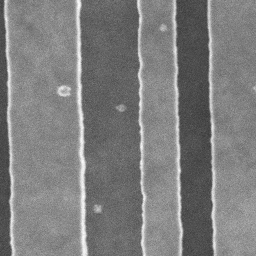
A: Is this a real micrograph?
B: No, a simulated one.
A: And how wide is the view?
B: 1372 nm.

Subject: lines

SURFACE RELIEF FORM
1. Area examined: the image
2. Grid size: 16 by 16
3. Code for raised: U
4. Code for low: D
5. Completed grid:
UUUUUDDDDUUDDUUU
UUUUUDDDDUUDDUUU
UUUUUDDDDUUDDUUU
UUUUUDDDDUUDDUUU
DUUUUDDDDUUDDUUU
DUUUUDDDDUUDDUUU
DUUUUDDDDUUDDUUU
DUUUUDDDDUUDDUUU
DUUUUDDDDUUDDUUU
DUUUUDDDDUUDDUUU
DUUUUDDDDUUDDUUU
DUUUUDDDDUUDDUUU
DUUUUDDDDUUDDUUU
DUUUUDDDDUUDDUUU
DUUUUDDDDUUDDUUU
DUUUUDDDDUUDDUUU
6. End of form